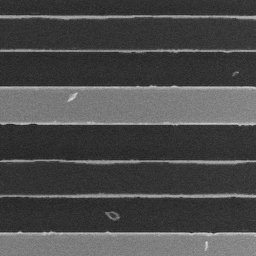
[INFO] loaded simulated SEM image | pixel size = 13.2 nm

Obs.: lines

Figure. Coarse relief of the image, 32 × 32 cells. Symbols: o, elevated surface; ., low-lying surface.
................................
................................
oooooooooooooooooooooooooooooooo
oooooooooooooooooooooooooooooooo
oooooooooooooooooooooooooooooooo
oooooooooooooooooooooooooooooooo
................................
................................
................................
................................
................................
oooooooooooooooooooooooooooooooo
oooooooooooooooooooooooooooooooo
oooooooooooooooooooooooooooooooo
oooooooooooooooooooooooooooooooo
..o......ooooooooooooooooooooooo
................................
................................
................................
................................
oooooooooooooooooooooooooooooooo
oooooooooooooooooooooooooooooooo
oooooooooooooooooooooooooooooooo
oooooooooooooooooooooooooooooooo
oooooooooooooooooooooooooooooooo
................................
................................
................................
................................
oooooooooooooooooooooooooooooooo
oooooooooooooooooooooooooooooooo
oooooooooooooooooooooooooooooooo